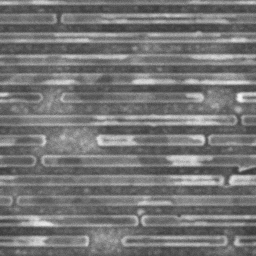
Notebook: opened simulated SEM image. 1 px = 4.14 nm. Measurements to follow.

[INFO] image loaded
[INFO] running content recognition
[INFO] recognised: parallel lines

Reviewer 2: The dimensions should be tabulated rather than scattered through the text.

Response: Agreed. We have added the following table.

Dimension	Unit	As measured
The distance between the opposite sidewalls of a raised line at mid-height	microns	0.0394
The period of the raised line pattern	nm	83.8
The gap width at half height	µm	0.0435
